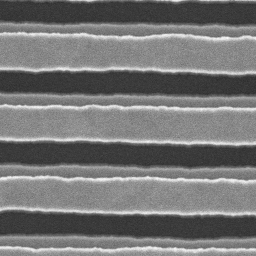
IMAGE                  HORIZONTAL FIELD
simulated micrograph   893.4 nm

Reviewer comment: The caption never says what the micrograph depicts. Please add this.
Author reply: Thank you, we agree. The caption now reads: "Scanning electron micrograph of lines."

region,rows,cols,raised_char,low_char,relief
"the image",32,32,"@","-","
--------------------------------
--------------------------------
--------------------------------
@@@@@@@@@@@@@@@@@@@@@@@@@@@@@@@@
@@@@@@@@@@@@@@@@@@@@@@@@@@@@@@@@
@@@@@@@@@@@@@@@@@@@@@@@@@@@@@@@@
@@@@@@@@@@@@@@@@@@@@@@@@@@@@@@@@
@@@@@@@@@@@@@@@@@@@@@@@@@@@@@@@@
@@@@@@@@@@@@@@@@@@@@@@@@@@@@@@@@
--------------------------------
--------------------------------
--------------------------------
@@@@@@@@@@@@@@@@@@@@@@@@@@@@@@@@
@@@@@@@@@@@@@@@@@@@@@@@@@@@@@@@@
@@@@@@@@@@@@@@@@@@@@@@@@@@@@@@@@
@@@@@@@@@@@@@@@@@@@@@@@@@@@@@@@@
@@@@@@@@@@@@@@@@@@@@@@@@@@@@@@@@
@@@@@@@@@@@@@@@@@@@@@@@@@@@@@@@@
--------------------------------
--------------------------------
--------------------------------
@@@@@@@@@@@@@@@@@@@@@@@@@@@@@@@@
@@@@@@@@@@@@@@@@@@@@@@@@@@@@@@@@
@@@@@@@@@@@@@@@@@@@@@@@@@@@@@@@@
@@@@@@@@@@@@@@@@@@@@@@@@@@@@@@@@
@@@@@@@@@@@@@@@@@@@@@@@@@@@@@@@@
---------@@@@@@@@@@@@@@@@@@@@@@@
--------------------------------
--------------------------------
-@@@@@-@@@@---------------------
@@@@@@@@@@@@@@@@@@@@@@@@@@@@@@@@
@@@@@@@@@@@@@@@@@@@@@@@@@@@@@@@@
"